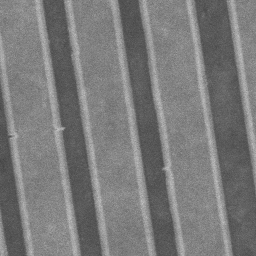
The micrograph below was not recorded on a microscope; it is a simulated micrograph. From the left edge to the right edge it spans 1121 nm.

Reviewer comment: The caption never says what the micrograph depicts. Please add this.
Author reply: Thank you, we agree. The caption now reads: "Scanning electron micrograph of one or a few lines or trenches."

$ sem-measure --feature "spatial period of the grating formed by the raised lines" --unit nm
327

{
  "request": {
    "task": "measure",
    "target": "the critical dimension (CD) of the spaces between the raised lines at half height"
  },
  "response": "134 nm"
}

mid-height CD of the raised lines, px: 44.1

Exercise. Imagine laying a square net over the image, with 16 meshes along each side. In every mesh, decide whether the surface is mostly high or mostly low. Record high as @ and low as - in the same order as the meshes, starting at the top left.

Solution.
@@--@@@--@@@---@
@@@--@@--@@@---@
@@@--@@--@@@---@
@@@--@@@--@@---@
@@@--@@@--@@---@
@@@--@@@--@@@--@
-@@--@@@--@@@--@
-@@--@@@--@@@---
-@@@--@@--@@@---
-@@@--@@@-@@@---
-@@@--@@@--@@---
-@@@--@@@--@@@--
-@@@--@@@--@@@--
--@@--@@@--@@@--
--@@@-@@@--@@@--
--@@@--@@--@@@--